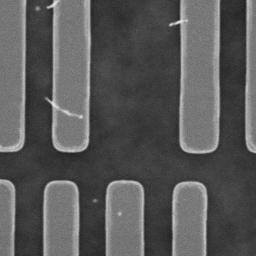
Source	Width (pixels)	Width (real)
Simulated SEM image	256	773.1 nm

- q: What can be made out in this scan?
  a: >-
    wiring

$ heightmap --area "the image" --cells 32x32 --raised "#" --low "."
###....####............####....#
###....####............####....#
###....####............####....#
###....####............####....#
###....####............####....#
###....####............####....#
###....####............####....#
###....####............####....#
###....####............####....#
###....####............####....#
###....####............####....#
###....####............####....#
###....####............####....#
###....####............####....#
###....####............####....#
###....####............####....#
###....####............####....#
###....####............####....#
###....####............####....#
................................
................................
................................
................................
##....####...#####....####......
##....####...#####....####......
##....####...#####....####......
##....####...#####....####......
##....####...#####....####......
##....####...#####....####......
##....####...#####....####......
##....####...#####....####......
##....####...#####....####......